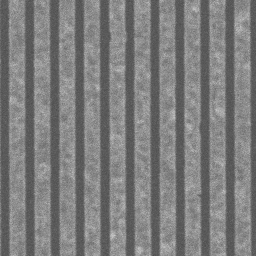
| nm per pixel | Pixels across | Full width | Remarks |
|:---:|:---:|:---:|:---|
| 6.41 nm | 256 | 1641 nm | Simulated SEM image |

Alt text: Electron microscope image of parallel lines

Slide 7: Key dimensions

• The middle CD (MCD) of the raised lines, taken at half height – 14.4 px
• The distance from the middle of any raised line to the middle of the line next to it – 161 nm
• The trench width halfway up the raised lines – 69.7 nanometres